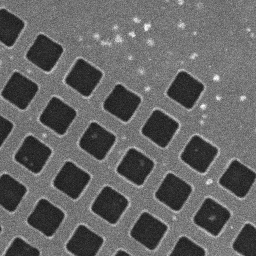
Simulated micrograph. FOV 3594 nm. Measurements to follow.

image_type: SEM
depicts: a regular array of holes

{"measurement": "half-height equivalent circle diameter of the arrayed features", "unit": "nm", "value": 481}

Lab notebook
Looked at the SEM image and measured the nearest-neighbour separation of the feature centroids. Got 640 nanometres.